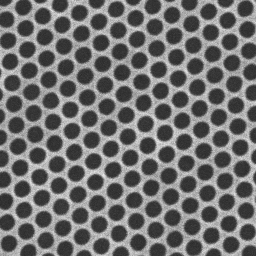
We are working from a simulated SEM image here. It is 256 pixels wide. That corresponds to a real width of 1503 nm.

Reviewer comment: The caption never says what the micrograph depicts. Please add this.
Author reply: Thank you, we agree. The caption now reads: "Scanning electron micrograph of a regular array of holes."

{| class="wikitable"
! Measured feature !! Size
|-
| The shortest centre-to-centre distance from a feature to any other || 0.123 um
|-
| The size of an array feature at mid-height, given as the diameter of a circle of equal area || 99.8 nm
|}